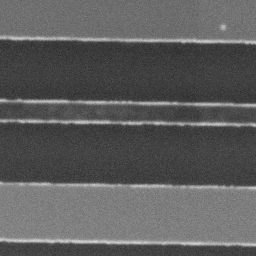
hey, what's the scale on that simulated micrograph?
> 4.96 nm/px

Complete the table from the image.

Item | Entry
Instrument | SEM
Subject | lines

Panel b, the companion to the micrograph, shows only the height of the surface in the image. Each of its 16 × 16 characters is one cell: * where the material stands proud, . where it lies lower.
****************
****************
.....***********
................
................
................
**************..
****************
................
................
................
****............
****************
****************
****************
................